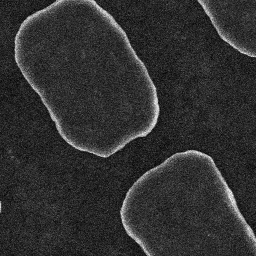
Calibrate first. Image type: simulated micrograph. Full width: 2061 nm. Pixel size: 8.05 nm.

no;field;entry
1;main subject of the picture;raised bodies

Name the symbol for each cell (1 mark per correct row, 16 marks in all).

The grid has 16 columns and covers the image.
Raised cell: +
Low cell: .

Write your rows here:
...+++.......+++
.++++++......+++
.+++++++......++
.++++++++.......
.++++++++.......
..++++++++......
...+++++++......
...+++++++......
....+++++.......
......+....+....
..........++++..
........++++++..
........+++++++.
........+++++++.
........++++++++
.........+++++++